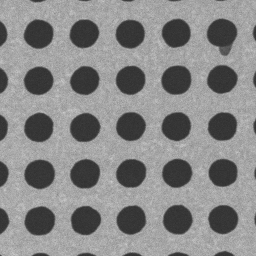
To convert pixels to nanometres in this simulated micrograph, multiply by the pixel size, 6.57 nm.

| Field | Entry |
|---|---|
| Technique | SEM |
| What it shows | a regular array of holes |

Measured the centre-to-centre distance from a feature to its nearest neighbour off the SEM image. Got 300 nanometers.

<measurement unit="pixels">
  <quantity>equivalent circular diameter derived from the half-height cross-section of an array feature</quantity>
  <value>29.3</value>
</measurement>